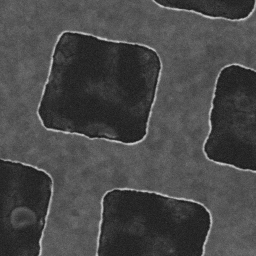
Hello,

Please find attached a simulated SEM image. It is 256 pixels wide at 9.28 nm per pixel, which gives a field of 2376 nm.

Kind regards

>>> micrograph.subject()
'holes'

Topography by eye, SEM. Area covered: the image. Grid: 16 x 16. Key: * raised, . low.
***********.....
****************
****...*********
***.......******
***.......****..
***.......***...
***.......***...
***......****...
*****....****...
*************...
..*************.
...*************
...***......****
.*.***.......***
...***.......***
...***.......***